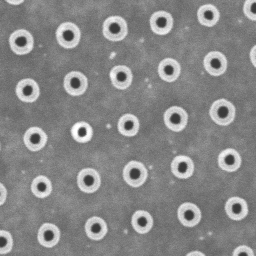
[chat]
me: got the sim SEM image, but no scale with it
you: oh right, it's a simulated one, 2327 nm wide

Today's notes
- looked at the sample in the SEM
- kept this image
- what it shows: a regular array of ring-shaped raised bodies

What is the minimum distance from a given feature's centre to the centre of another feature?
427 nm